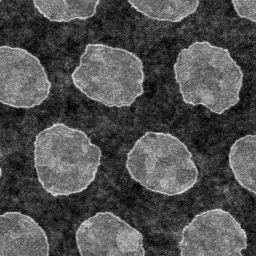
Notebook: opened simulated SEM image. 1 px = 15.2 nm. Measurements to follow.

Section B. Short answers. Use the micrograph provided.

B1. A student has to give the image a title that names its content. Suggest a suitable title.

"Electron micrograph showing raised bodies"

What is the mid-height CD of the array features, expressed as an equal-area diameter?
982 nm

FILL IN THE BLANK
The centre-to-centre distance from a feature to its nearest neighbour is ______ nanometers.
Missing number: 1460